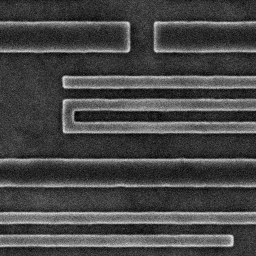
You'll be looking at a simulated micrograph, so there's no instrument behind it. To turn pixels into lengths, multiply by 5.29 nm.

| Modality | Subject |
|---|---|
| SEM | wiring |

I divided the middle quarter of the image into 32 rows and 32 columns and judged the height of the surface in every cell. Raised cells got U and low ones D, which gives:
DDDDDDDDDDDDDDDDDDDDDDDDDDDDDDDD
DDDDDDDDDDDDDDDDDDDDDDDDDDDDDDDD
DDDDDDDDDDDDDDDDDDDDDDDDDDDDDDDD
UUUUUUUUUUUUUUUUUUUUUUUUUUUUUUUU
UUUUUUUUUUUUUUUUUUUUUUUUUUUUUUUU
UUUUUUUUUUUUUUUUUUUUUUUUUUUUUUUU
DDDDDDDDDDDDDDDDDDDDDDDDDDDDDDDD
DDDDDDDDDDDDDDDDDDDDDDDDDDDDDDDD
DDDDDDDDDDDDDDDDDDDDDDDDDDDDDDDD
UUUUUUUUUUUUUUUUUUUUUUUUUUUUUUUU
UUUUUUUUUUUUUUUUUUUUUUUUUUUUUUUU
UUUDDDDDDDDDDDDDDDDDDDDUUUUDDDDD
UUDDDDDDDDDDDDDDDDDDDDDDDDDDDDDD
UUDDDDDDDDDDDDDDDDDDDDDDDDDDDDDD
UUUDDDDDDDDDDDDDDDDDDDDDDDDDDDDD
UUUUUUUUUUUUUUUUUUUUUUUUUUUUUUUU
UUUUUUUUUUUUUUUUUUUUUUUUUUUUUUUU
DDDDDDDDDDDDDDDDDDDDDDDDDDDDDDDD
DDDDDDDDDDDDDDDDDDDDDDDDDDDDDDDD
DDDDDDDDDDDDDDDDDDDDDDDDDDDDDDDD
DDDDDDDDDDDDDDDDDDDDDDDDDDDDDDDD
DDDDDDDDDDDDDDDDDDDDDDDDDDDDDDDD
DDDDDDDDDDDDDDDDDDDDDDDDDDDDDDDD
DDDDDDDDDDDDDDDDDDDDDDDDDDDDDDDD
UUUUUUUUUUUUUUUUUUUUUUUUUUUUUUUU
UUUUUUUUUUUUUUUUUUUUUUUUUUUUUUUU
UUUUUUUUUUUUUUUUUUUUUUUUUUUUUUUU
UUUUUUUUUUUUUUUUUUUUUUUUUUUUUUUU
UUUUUUUUUUUUUUUUUUUUUUUUUUUUUUUU
UUUUUUUUUUUUUUUUUUUUUUUUUUUUUUUU
UUUUUUUUUUUUUUDUUUUUUUUUUDUUUUUU
DDDDDDDDDDDDDDDDDDDDDDDDDDDDDDDD